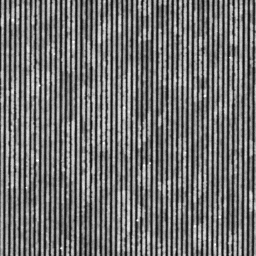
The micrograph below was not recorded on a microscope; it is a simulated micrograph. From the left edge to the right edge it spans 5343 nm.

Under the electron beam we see parallel lines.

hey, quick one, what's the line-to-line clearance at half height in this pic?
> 0.0417 um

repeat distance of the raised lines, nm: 106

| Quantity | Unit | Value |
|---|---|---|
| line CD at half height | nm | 60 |